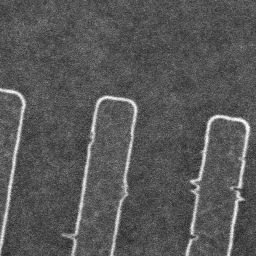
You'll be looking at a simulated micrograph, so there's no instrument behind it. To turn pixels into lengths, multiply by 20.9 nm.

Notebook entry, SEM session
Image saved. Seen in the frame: one or a few lines or trenches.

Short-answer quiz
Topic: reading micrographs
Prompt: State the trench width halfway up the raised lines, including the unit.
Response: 1520 nanometres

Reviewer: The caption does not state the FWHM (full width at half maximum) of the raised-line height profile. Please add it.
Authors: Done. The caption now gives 834 nanometres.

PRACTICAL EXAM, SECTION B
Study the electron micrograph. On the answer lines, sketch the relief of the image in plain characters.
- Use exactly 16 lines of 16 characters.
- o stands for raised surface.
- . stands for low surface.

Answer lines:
................
................
................
................
................
................
o.....oo........
o.....oo.....oo.
o.....oo.....oo.
o.....oo.....oo.
o....ooo.....oo.
o....ooo....ooo.
o....ooo....ooo.
.....oo.....ooo.
.....oo.....ooo.
.....oo.....oo..